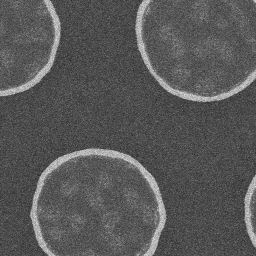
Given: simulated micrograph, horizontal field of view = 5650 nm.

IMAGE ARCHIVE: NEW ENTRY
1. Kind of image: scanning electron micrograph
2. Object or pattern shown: raised bodies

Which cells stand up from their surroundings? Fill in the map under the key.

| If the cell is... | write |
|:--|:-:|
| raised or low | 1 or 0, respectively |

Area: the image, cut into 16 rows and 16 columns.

1110000001111111
1111000001111111
1111000001111111
1110000001111111
1110000000111111
1000000000111110
0000000000000000
0000000000000000
0000000000000000
0000010000000000
0001111110000000
0001111111000000
0011111111000000
0011111111000001
0011111111000000
0001111111000000